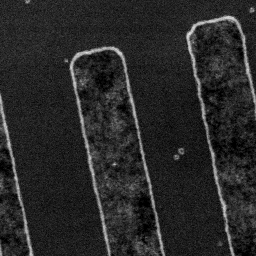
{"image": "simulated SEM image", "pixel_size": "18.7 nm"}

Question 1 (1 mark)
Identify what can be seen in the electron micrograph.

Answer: one or a few lines or trenches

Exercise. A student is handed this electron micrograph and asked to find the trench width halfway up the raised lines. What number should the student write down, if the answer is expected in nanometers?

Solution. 1280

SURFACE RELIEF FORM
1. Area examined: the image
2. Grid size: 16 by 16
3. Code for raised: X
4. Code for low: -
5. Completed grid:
----------------
-------------XX-
------------XXX-
-----XXX----XXX-
-----XXX----XXXX
-----XXX----XXXX
-----XXX-----XXX
-----XXXX----XXX
-----XXXX----XXX
X-----XXX----XXX
X-----XXX----XXX
X-----XXX-----XX
X-----XXXX----XX
XX----XXXX----XX
XX-----XXX----XX
XX-----XXX----XX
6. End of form